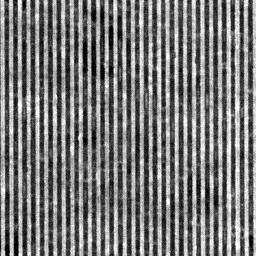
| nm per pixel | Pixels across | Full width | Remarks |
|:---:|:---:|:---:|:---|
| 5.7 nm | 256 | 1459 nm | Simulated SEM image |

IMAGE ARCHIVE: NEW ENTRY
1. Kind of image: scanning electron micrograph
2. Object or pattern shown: parallel lines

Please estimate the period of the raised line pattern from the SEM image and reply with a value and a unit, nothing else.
49.6 nm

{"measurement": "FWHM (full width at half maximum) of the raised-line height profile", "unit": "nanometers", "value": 16.4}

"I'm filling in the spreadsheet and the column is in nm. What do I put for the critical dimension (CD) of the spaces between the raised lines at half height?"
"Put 32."